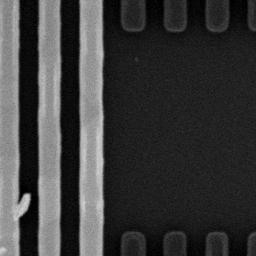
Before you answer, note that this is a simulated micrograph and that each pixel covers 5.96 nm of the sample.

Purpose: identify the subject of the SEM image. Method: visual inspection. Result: wiring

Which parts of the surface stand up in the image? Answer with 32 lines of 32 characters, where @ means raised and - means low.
@@---@@---@@@--@@@---@@---@@@--@
@@---@@---@@@--@@@---@@---@@@--@
@@---@@@--@@@--@@@---@@---@@@--@
@@---@@@--@@@--@@@---@@---@@---@
@@---@@---@@@-------------------
@@---@@---@@@-------------------
@@---@@---@@@-------------------
@@---@@@--@@@-------------------
@@---@@@--@@@-------------------
@@---@@@--@@@-------------------
@@---@@---@@@-------------------
@@---@@---@@@-------------------
@@---@@---@@@-------------------
@@---@@---@@@-------------------
@@---@@---@@@-------------------
@@---@@---@@@-------------------
@@---@@@--@@@-------------------
@@---@@@--@@@-------------------
@@---@@@--@@@-------------------
@@---@@@--@@@-------------------
@@---@@---@@@-------------------
@@---@@---@@@-------------------
@@---@@---@@@-------------------
@@---@@---@@@-------------------
@@@@-@@---@@@-------------------
@@@@-@@---@@@-------------------
@@@--@@---@@@-------------------
@@---@@---@@@-------------------
@@---@@---@@@-------------------
@@---@@---@@@--@@@---@@---@@---@
@@---@@---@@@--@@@---@@---@@---@
@@---@@---@@@--@@@---@@---@@---@